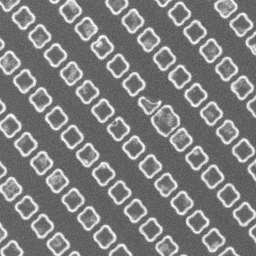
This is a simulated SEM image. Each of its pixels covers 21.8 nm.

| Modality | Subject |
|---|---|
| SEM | a regular array of raised bodies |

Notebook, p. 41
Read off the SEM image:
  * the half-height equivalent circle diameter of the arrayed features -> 0.413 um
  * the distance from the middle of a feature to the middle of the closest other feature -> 530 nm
